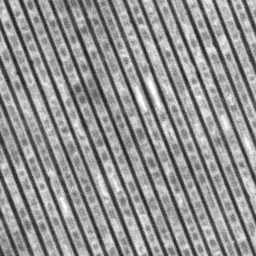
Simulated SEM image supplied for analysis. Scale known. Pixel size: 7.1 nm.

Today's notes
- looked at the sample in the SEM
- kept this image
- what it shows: parallel lines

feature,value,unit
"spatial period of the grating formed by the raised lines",98.1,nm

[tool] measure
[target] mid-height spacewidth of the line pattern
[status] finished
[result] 40.5 nm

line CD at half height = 61.1 nm